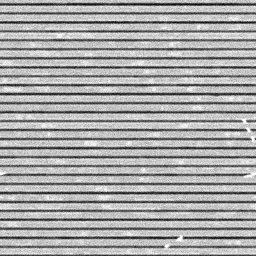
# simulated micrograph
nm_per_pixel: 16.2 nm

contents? parallel lines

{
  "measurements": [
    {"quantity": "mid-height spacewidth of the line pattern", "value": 42.7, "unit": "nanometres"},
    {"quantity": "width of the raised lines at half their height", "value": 6.13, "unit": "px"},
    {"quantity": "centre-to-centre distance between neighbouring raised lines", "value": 0.146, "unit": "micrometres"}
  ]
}